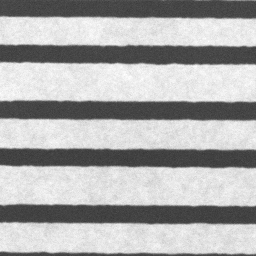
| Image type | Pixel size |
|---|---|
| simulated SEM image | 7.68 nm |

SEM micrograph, lines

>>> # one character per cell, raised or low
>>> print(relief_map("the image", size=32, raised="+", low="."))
................................
................................
++++++++++++++++++++++++++++++++
++++++++++++++++++++++++++++++++
++++++++++++++++++++++++++++++++
+++.++++++++++++++++++++++++++++
................................
................................
++++++++++++++++++++++++++++++++
++++++++++++++++++++++++++++++++
++++++++++++++++++++++++++++++++
++++++++++++++++++++++++++++++++
++.....+++++++++++++++++++++++++
................................
................................
++++++++++++++++++++++++++++++++
++++++++++++++++++++++++++++++++
++++++++++++++++++++++++++++++++
.....++....+++++++++++++++++++++
................................
................................
++++++++++++++++++++++++++++++++
++++++++++++++++++++++++++++++++
++++++++++++++++++++++++++++++++
++++++++++++++++++++++++++++++++
+........+.+++++++++++++++++++++
................................
................................
++++++++++++++++++++++++++++++++
++++++++++++++++++++++++++++++++
++++++++++++++++++++++++++++++++
......+..+..++++++++++++++++++++